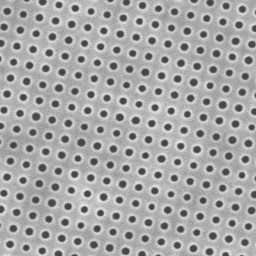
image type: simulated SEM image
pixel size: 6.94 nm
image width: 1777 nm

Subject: a regular array of holes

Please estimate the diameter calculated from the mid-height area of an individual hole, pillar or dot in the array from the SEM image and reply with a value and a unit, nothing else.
50.8 nm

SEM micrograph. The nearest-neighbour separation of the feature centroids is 112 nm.